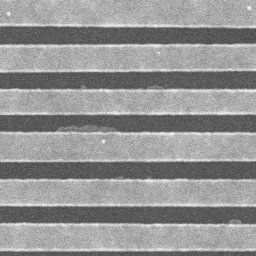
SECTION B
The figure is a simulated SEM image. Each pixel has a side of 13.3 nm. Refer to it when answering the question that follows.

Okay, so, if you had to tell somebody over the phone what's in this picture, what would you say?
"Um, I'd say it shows lines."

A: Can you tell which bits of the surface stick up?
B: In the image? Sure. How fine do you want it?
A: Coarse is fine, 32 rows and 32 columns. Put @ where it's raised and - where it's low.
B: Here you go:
@@@@@@@@@@@@@@@@@@@@@@@@@@@@@@@@
@@@@@@@@@@@@@@@@@@@@@@@@@@@@@@@@
@@@@@@@@@@@@@@@@@@@@@@@@@@@@@@@@
--------------------------------
--------------------------------
--------------------------------
@@@@@@@@@@@@@@@@@@@@@@@@@@@@@@@@
@@@@@@@@@@@@@@@@@@@@@@@@@@@@@@@@
@@@@@@@@@@@@@@@@@@@@@@@@@@@@@@@@
--------------------------------
--------------------------------
@@@@@@@@@@@@@@@@@@@@@@@@@@@@@@@@
@@@@@@@@@@@@@@@@@@@@@@@@@@@@@@@@
@@@@@@@@@@@@@@@@@@@@@@@@@@@@@@@@
--------------------------------
--------------------------------
@------@@@----------------------
@@@@@@@@@@@@@@@@@@@@@@@@@@@@@@@@
@@@@@@@@@@@@@@@@@@@@@@@@@@@@@@@@
@@@@@@@@@@@@@@@@@@@@@@@@@@@@@@@@
--------------------------------
--------------------------------
@@@@@@@@@@@@@@@@@@@@@@@@@@@@@@@@
@@@@@@@@@@@@@@@@@@@@@@@@@@@@@@@@
@@@@@@@@@@@@@@@@@@@@@@@@@@@@@@@@
@@@@@@@@@@@@@@@@@@@@@@@@@@@@@@@@
--------------------------------
--------------------------------
@@@@@@@@@@@@@@@@@@@@@@@@@@@@@@@@
@@@@@@@@@@@@@@@@@@@@@@@@@@@@@@@@
@@@@@@@@@@@@@@@@@@@@@@@@@@@@@@@@
--------------------------------